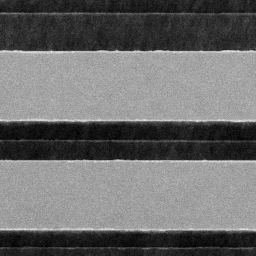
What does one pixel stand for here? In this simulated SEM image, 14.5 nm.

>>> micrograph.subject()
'lines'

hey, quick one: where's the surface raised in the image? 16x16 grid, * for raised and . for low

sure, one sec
................
................
................
****************
****************
****************
****************
****************
................
................
****************
****************
****************
****************
................
................